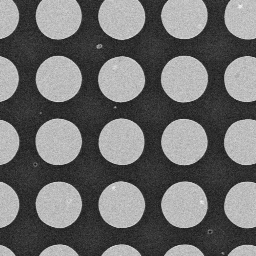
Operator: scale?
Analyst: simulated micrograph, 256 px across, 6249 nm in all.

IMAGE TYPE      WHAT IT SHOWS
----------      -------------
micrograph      an array of small figures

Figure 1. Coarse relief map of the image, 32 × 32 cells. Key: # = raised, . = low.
##...#####...#####...#####...###
##...#####..######..######..####
##...#####..######..######..####
##...#####...#####...####...####
#.....###.....###.....##.....###
................................
................................
#.....###.....###....####....###
##...#####...#####...#####..####
##...#####..######..######..####
##...#####..######..######..####
##...#####...#####...####...####
#.....##......##......##......##
................................
................................
#.....###....####....####....###
##...#####...#####..######..####
##...#####..######..######..####
##...#####..######..######..####
##...#####...####....####....###
......##......##......##......##
................................
................................
#....####....####....####....###
##...#####...#####..######..####
##...#####..######..######..####
##...#####..######..######..####
##...####....####....####....###
................................
................................
................................
##...####....####....####....###